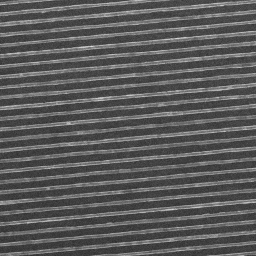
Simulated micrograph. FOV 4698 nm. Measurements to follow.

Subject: parallel lines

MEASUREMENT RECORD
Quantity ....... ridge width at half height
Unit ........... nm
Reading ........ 52.5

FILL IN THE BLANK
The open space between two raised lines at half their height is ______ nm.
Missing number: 135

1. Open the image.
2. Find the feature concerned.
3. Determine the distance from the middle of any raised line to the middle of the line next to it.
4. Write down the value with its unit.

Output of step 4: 192 nanometers